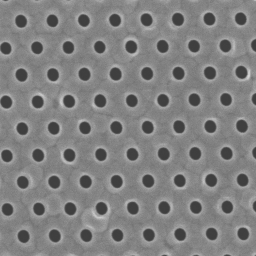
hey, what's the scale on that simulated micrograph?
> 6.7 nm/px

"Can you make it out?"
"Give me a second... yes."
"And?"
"a regular array of holes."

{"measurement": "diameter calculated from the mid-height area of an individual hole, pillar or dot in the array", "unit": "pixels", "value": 12.1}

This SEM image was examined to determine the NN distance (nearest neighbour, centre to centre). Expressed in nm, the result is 207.